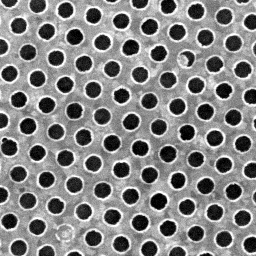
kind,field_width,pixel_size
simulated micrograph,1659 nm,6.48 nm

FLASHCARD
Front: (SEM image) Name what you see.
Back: a regular array of holes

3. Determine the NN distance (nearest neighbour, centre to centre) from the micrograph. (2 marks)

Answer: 180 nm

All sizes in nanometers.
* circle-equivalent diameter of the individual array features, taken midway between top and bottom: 110